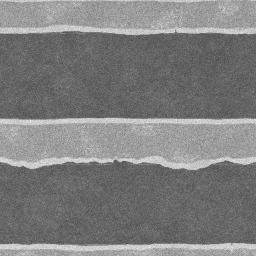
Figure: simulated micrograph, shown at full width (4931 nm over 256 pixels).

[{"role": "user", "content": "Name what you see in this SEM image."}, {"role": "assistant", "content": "one or a few lines or trenches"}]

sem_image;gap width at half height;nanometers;1700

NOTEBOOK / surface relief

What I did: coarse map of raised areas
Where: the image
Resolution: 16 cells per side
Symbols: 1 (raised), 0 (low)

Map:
1111111111111111
1111111111111111
0000000000000000
0000000000000000
0000000000000000
0000000000000000
0000000000000000
0000001100000000
1111111111111111
1111111111111111
0000000000000000
0000000000000000
0000000000000000
0000000000000000
0000000000000000
1111111111111111